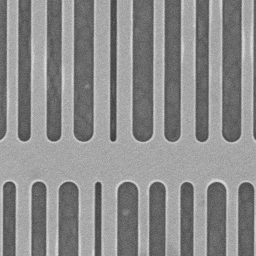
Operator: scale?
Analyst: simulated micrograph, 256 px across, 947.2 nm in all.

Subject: groups of lines, slits or small figures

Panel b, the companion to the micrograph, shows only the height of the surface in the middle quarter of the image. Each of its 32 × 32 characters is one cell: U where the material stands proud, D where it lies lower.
UUDDDDDDUUUDDUUUUDDDDDUUUDDDDUUU
UUDDDDDDUUUDDUUUUDDDDDUUUDDDDUUU
UUDDDDDDUUUDDUUUUDDDDDUUUDDDDUUU
UUDDDDDDUUUDDUUUUDDDDDUUUDDDDUUU
UUDDDDDDUUUDDUUUUDDDDDUUUDDDDUUU
UUDDDDDDUUUDDUUUUDDDDDUUUDDDDUUU
UUDDDDDDUUUDDUUUUDDDDDUUUDDDDUUU
UUDDDDDDUUUDDUUUUDDDDDUUUDDDDUUU
UUDDDDDDUUUDDUUUUDDDDDUUUDDDDUUU
UUDDDDDDUUUDDUUUUDDDDDUUUDDDDUUU
UUDDDDDDUUUDDUUUUDDDDDUUUDDDDUUU
UUDDDDDDUUUDDUUUUDDDDDUUUDDDDUUU
UUDDDDDDUUUDDUUUUDDDDDUUUDDDDUUU
UUDDDDDDUUUDDUUUUDDDDDUUUDDDDUUU
UUDDDDDDUUUDDUUUUDDDDDUUUDDDDUUU
UUDDDDDDUUUDDUUUUDDDDDUUUDDDDUUU
UUDDDDDDUUUDDUUUUDDDDDUUUDDDDUUU
UUDDDDDUUUUDDUUUUDDDDDUUUDDDDUUU
UUUDDDDUUUUDDUUUUUDDDDUUUDDDDUUU
UUUUUUUUUUUUUUUUUUUUUUUUUUUUUUUU
UUUUUUUUUUUUUUUUUUUUUUUUUUUUUUUU
UUUUUUUUUUUUUUUUUUUUUUUUUUUUUUUU
UUUUUUUUUUUUUUUUUUUUUUUUUUUUUUUU
UUUUUUUUUUUUUUUUUUUUUUUUUUUUUUUU
UUUUUUUUUUUUUUUUUUUUUUUUUUUUUUUU
UUUUUUUUUUUUUUUUUUUUUUUUUUUUUUUU
UUUUUUUUUUUUUUUUUUUUUUUUUUUUUUUU
UUUUUUUUUUUUUUUUUUUUUUUUUUUUUUUU
UUUUUUUUUUUUUUUUUUUUUUUUUUUUUUUU
DDUUUUUUDUUUUUUDDUUUUUDDUUUUUUDU
DDDUUUUUDDUUUUDDDDUUUDDDDUUUUDDD
DDDDUUUUDDUUUDDDDDDUUDDDDDUUUDDD